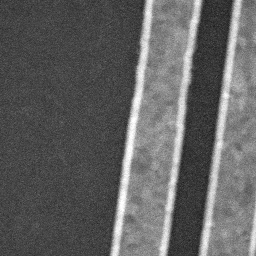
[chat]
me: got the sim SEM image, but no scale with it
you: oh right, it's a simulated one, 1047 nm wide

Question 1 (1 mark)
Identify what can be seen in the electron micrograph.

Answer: one or a few lines or trenches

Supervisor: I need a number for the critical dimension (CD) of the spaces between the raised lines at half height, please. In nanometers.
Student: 168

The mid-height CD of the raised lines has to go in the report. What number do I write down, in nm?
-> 190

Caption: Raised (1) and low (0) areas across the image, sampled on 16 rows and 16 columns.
0000000001110001
0000000001110001
0000000001110001
0000000001110011
0000000001110011
0000000001100011
0000000001100011
0000000011100011
0000000011100011
0000000011100011
0000000011100111
0000000011100111
0000000011100111
0000000011000111
0000000111000111
0000000111000111